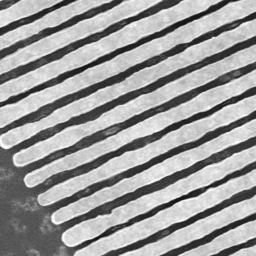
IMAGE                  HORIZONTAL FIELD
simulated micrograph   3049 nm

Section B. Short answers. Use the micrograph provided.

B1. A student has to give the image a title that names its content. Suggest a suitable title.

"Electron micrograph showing parallel lines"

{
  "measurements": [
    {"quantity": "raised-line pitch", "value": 272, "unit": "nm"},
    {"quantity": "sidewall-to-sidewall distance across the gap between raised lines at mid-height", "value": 7.85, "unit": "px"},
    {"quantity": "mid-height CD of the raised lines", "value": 178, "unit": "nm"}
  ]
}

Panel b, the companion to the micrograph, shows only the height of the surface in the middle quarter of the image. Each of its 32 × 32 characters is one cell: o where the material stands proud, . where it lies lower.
ooooo...ooooooooo.....ooooooooo.
o....oooooooooo....ooooooooo....
....ooooooooo....ooooooooo.....o
.oooooooooo.....oooooooo.....ooo
oooooooo......oooooooo.....ooooo
oooooo......oooooooo.....ooooooo
oooo.....ooooooooo.....oooooooo.
o......oooooooo......oooooooo...
.....oooooooo.....ooooooooo.....
...oooooooo......oooooooo......o
.ooooooo.....oooooooooo......ooo
oooooo......oooooooo.......ooooo
oooo......ooooooooo....ooooooooo
o........ooooooo......ooooooooo.
.......ooooooo.....ooooooooo....
...oooooooo......ooooooooo....oo
ooooooooo......ooooooooo....oooo
ooooooo......ooooooooo....oooooo
oooo.......ooooooo.......ooooooo
ooo......ooooooo.......oooooooo.
oo.....ooooooo......oooooooo....
....ooooooooo.....oooooooo.....o
..oooooooo.....ooooooooo.....ooo
oooooooo....oooooooooo.....ooooo
oooooo.....ooooooooo.....ooooooo
ooo......ooooooooo....ooooooooo.
o......oooooooo......oooooooo...
.....oooooooo......oooooooo.....
..ooooooooo.....ooooooooo......o
oooooooo......ooooooooo.....oooo
oooooo......oooooooo......oooooo
oooo.....ooooooooo......oooooooo